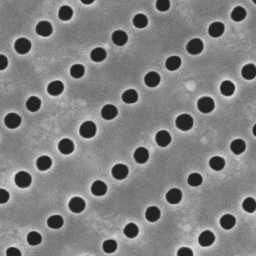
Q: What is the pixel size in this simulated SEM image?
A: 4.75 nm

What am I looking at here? a regular array of holes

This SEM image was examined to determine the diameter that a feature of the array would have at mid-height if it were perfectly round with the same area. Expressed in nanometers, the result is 75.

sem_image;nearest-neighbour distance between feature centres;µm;0.128